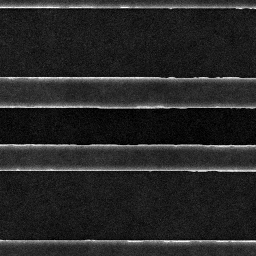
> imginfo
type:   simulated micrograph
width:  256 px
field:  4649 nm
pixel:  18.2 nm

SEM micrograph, lines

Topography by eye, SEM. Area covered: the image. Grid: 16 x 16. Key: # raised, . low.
................
................
................
................
................
################
################
................
................
################
################
................
................
................
................
################